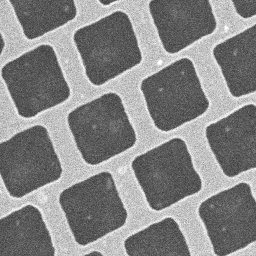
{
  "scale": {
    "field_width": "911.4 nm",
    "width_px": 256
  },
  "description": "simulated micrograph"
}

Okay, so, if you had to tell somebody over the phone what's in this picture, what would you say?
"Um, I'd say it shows holes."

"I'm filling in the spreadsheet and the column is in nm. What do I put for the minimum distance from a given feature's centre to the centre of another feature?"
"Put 283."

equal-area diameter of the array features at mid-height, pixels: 65